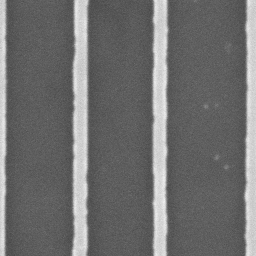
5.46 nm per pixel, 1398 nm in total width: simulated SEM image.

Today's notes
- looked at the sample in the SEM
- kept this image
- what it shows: lines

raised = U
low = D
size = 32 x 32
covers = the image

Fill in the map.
UDDDDDDDDUUDDDDDDDDUUDDDDDDDDDDU
UDDDDDDDDUUDDDDDDDDUUDDDDDDDDDDU
UDDDDDDDDUUDDDDDDDDUUDDDDDDDDDDU
UDDDDDDDDUUDDDDDDDDUUDDDDDDDDDDU
UDDDDDDDDUUDDDDDDDDUUDDDDDDDDDDU
UDDDDDDDDUUDDDDDDDDUUDDDDDDDDDDU
UDDDDDDDDDUDDDDDDDDUUDDDDDDDDDDU
UDDDDDDDDUUDDDDDDDDUUDDDDDDDDDDU
UDDDDDDDDUUDDDDDDDDUUDDDDDDDDDDU
UDDDDDDDDUUDDDDDDDDUUDDDDDDDDDDU
UDDDDDDDDUUDDDDDDDDUUDDDDDDDDDDU
UDDDDDDDDUUDDDDDDDDUUDDDDDDDDDDU
UDDDDDDDDUUDDDDDDDDUUDDDDDDDDDDU
UDDDDDDDDUUDDDDDDDDUUDDDDDDDDDDU
UDDDDDDDDUUDDDDDDDDUUDDDDDDDDDDU
UDDDDDDDDUUDDDDDDDDUUDDDDDDDDDDU
UDDDDDDDDUUDDDDDDDDUUDDDDDDDDDDU
UDDDDDDDDUUDDDDDDDDUUDDDDDDDDDDU
UDDDDDDDDUUDDDDDDDDUUDDDDDDDDDDU
UDDDDDDDDUUDDDDDDDDUUDDDDDDDDDDU
DDDDDDDDDUUDDDDDDDDUUDDDDDDDDDDU
DDDDDDDDDUUDDDDDDDDUUDDDDDDDDDDU
UDDDDDDDDUUDDDDDDDDUUDDDDDDDDDDU
UDDDDDDDDUUDDDDDDDDUUDDDDDDDDDDU
UDDDDDDDDUUDDDDDDDDUUDDDDDDDDDDU
DDDDDDDDDUUDDDDDDDDUUDDDDDDDDDDU
DDDDDDDDDUUDDDDDDDDUUDDDDDDDDDDU
DDDDDDDDDUUDDDDDDDDUUDDDDDDDDDDU
DDDDDDDDDUUDDDDDDDDUUDDDDDDDDDDU
DDDDDDDDDUUDDDDDDDDUUDDDDDDDDDDU
DDDDDDDDDUUDDDDDDDDUUDDDDDDDDDDU
DDDDDDDDDUUDDDDDDDDUUDDDDDDDDDDU